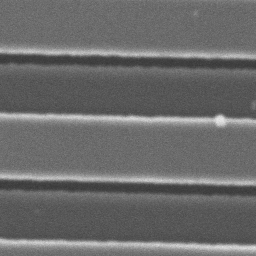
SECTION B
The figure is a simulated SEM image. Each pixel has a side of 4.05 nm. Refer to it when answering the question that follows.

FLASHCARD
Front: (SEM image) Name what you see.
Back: lines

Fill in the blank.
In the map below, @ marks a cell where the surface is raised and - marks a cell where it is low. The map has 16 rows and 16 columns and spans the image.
@@@@@@@@@@@@@@@@
@@@@@@@@@@@@@@@@
@@@@@@@@@@@@@@@@
----------@@@@@@
----------------
----------------
----------------
@@@@@@@@@@@@@@@@
@@@@@@@@@@@@@@@@
@@@@@@@@@@@@@@@@
@@@@@@@@@@@@@@@@
-------------@@@
----------------
----------------
----------------
@@@@@@@@@@@@@@@@